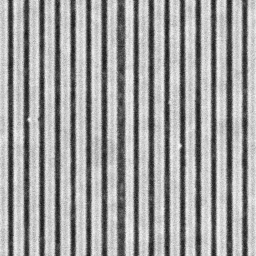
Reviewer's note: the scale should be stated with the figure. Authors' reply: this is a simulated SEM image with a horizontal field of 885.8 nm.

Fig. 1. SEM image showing parallel lines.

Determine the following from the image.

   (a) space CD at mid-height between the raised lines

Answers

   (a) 23.3 nanometers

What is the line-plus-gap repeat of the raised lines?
0.054 µm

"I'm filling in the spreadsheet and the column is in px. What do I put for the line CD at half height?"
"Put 8.5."